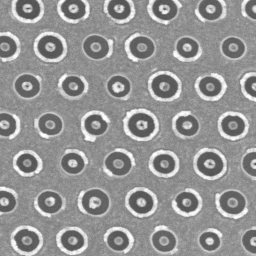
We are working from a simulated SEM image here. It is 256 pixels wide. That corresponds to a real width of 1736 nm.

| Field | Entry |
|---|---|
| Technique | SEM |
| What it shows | a regular array of ring-shaped grooves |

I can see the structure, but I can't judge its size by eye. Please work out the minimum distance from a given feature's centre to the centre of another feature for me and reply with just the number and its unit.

302 nm